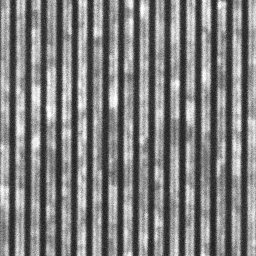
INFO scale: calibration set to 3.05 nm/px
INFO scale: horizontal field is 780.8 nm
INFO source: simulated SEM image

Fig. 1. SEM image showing parallel lines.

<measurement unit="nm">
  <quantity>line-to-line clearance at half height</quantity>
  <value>23.6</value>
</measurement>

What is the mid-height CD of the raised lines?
0.0236 microns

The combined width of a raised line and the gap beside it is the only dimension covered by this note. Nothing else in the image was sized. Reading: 47.1 nm